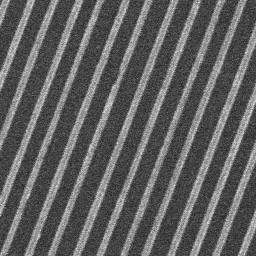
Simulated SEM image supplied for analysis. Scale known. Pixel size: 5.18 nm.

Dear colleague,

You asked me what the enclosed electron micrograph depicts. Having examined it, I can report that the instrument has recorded parallel lines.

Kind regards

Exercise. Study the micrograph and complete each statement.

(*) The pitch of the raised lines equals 114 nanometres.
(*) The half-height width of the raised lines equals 25.4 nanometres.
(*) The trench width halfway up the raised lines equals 0.0853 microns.